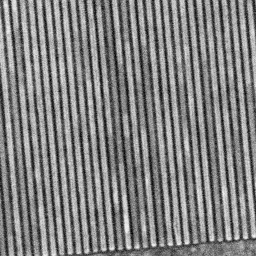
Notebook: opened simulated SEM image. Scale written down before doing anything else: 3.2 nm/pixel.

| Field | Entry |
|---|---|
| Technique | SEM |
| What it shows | parallel lines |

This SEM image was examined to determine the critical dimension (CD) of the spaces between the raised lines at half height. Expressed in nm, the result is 15.5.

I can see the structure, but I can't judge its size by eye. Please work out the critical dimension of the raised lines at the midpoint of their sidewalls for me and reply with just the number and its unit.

12.4 nm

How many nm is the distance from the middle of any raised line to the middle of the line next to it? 26.8